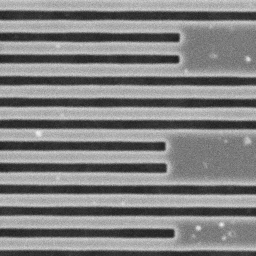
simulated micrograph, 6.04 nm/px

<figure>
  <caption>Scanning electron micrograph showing groups of lines, slits or small figures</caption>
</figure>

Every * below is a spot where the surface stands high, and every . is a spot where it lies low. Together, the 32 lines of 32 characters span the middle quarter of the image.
********************************
********************************
********************************
................................
................................
................................
********************************
********************************
................................
................................
................................
********************************
********************************
********************************
................................
................................
**********......................
********************************
********************************
.........................*******
..........................******
.........................*******
********************************
********************************
********************************
..........................******
..........................******
********************************
********************************
********************************
................................
................................